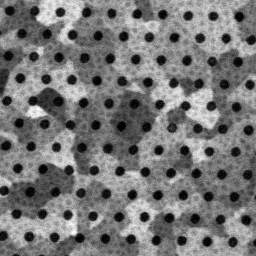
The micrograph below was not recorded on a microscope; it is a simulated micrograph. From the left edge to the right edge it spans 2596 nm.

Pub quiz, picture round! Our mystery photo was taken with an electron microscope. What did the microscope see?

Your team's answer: a regular array of holes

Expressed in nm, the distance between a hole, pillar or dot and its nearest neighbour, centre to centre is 254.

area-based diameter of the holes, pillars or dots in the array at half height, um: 0.113